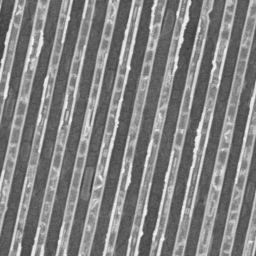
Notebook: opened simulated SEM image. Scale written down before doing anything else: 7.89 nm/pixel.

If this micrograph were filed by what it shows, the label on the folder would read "parallel lines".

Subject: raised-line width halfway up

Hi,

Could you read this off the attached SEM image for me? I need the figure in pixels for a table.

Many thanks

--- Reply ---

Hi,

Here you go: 10.2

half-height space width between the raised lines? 0.101 µm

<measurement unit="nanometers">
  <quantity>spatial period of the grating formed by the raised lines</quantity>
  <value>181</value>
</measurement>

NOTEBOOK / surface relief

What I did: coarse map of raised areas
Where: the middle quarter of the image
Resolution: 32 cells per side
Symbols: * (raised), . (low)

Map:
..***...**....**....**....**...*
..**....**....**....**...***...*
.***....**...***...**....**....*
.***...***...***...**....**....*
.**....**....***...**....**....*
.**....**....**....**....**...**
.**....**...***....**...***...**
.**....**...***...***...**....**
***...**....***...**....**....**
***...**....**....**....**....**
**....**....**....**....**...***
**....**...***...***...***...**.
**....**...***...**....**....**.
**...**....**....**....**....**.
**...**....***...**....**....**.
*....**....**....**...***...***.
*....**...***...***...***...**..
*...***...***...**....**....**..
*...**....***...**....**....**..
*...**....**....**....**...***..
....**...***....**...***...***..
....**...***...***...**....**...
...***...***...**....**....**...
...**....**....**....**....**...
...**....**....**...***...***...
...**...***....**...***...**....
...**...***...***...**....**....
..**....***...***...**....**...*
..**....**....***...**...***...*
..**....**....**...***...***...*
..**...***...***...***...**....*
.***...***...***...**....**....*